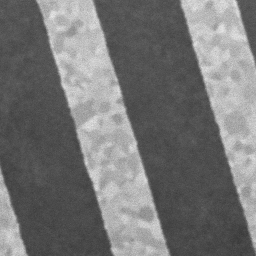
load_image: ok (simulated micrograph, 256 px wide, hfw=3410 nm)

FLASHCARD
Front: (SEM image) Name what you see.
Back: one or a few lines or trenches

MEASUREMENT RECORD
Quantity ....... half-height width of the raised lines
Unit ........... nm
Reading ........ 693